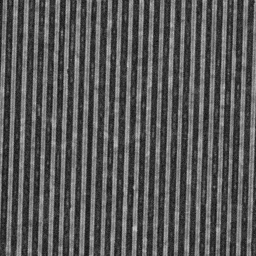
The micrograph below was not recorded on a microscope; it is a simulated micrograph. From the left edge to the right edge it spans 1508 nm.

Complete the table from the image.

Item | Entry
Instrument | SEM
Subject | parallel lines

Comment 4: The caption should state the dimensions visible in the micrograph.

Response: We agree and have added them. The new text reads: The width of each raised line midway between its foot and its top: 16.2 nanometers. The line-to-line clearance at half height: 44.2 nanometers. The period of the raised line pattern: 61.6 nanometres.